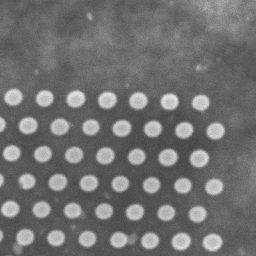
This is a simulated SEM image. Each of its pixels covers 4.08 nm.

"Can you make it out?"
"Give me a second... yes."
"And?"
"a regular array of raised bodies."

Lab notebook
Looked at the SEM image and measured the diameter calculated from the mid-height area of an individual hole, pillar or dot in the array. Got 63.9 nm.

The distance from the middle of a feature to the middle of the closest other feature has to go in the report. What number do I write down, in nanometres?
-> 127